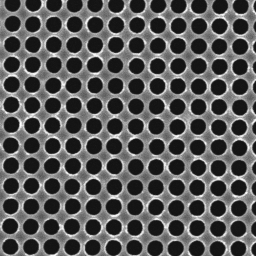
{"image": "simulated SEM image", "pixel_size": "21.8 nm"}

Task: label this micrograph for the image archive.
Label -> a regular array of holes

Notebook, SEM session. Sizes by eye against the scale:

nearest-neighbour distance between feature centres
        435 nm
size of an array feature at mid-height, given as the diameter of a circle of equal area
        353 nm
